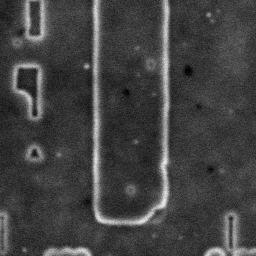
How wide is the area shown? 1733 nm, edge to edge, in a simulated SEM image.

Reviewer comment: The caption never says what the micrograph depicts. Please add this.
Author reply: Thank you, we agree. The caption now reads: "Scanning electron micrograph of wiring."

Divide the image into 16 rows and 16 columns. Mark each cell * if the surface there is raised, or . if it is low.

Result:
......****......
......****......
......****......
......****......
......****......
......****......
......****......
......****......
......****......
......****......
......****......
......****......
......****......
......***.......
................
................